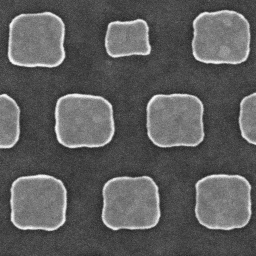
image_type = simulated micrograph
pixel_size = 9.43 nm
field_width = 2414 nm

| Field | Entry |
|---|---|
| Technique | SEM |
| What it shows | a regular array of raised bodies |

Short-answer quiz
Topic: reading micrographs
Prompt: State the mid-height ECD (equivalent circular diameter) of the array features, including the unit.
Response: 548 nm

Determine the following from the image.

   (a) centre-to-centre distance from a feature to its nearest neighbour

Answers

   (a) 865 nm